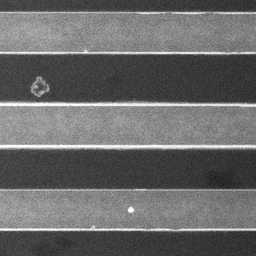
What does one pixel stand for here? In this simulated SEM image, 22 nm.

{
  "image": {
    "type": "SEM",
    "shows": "lines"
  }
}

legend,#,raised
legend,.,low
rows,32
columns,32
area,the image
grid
################################
################################
................................
................................
................................
................................
................................
################################
################################
################################
################################
################################
################################
................................
................................
................................
................................
................................
################################
################################
################################
################################
################################
################################
................................
................................
................................
................................
................................
################################
################################
################################